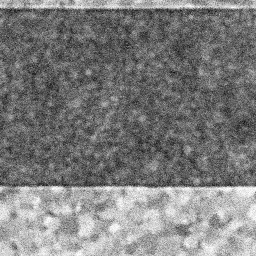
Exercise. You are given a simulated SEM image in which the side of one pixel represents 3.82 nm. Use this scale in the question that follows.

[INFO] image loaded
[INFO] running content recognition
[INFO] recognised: one or a few lines or trenches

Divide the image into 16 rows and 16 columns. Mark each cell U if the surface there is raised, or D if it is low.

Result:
DUDDDDDDDDDDDDDD
DDDDDDDDDDDDDDDD
DDDDDDDDDDDDDDDD
DDDDDDDDDDDDDDDD
DDDDDDDDDDDDDDDD
DDDDDDDDDDDDDDDD
DDDDDDDDDDDDDDDD
DDDDDDDDDDDDDDDD
DDDDDDDDDDDDDDDD
DDDDDDDDDDDDDDDD
DDDDDDDDDDDDDDDD
DDDDDDDDDDDDDDDD
UUUUUUUUUUUUUUUU
UUUUUUUUUUUUUUUU
UUUUUUUUUUUUUUUU
UUUUUUUUUUUUUUUU